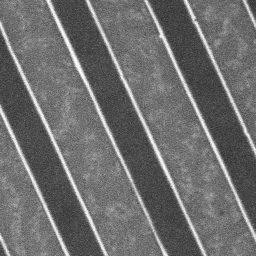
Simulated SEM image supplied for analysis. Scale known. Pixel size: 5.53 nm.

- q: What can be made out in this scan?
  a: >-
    one or a few lines or trenches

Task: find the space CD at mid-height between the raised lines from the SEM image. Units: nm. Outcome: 293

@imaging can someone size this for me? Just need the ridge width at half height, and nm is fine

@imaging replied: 200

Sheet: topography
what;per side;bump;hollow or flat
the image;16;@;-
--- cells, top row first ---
---@@@---@@@---@
----@@----@@----
----@@@---@@@---
@----@@----@@---
@----@@@---@@@--
@@---@@@----@@--
@@----@@----@@@-
@@@---@@@----@@-
-@@----@@----@@@
-@@@---@@@----@@
--@@----@@----@@
--@@@---@@@---@@
---@@----@@----@
---@@@---@@@---@
---@@@----@@----
----@@----@@@---